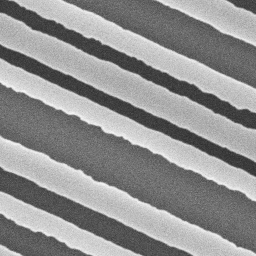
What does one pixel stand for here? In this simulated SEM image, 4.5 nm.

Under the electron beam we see lines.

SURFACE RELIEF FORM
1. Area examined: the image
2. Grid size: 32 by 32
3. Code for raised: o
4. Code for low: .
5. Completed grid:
..ooooooo............oooooooo...
....ooooooo............oooooooo.
oo.....oooooo............ooooooo
oooo.....oooooo............ooooo
oooooo.....ooooooo...........ooo
ooooooooo....ooooooo............
...oooooooo....ooooooo..........
.....oooooooo.....oooooo........
ooo....oooooooo....ooooooo......
ooooo....ooooooooo....oooooo....
ooooooo....oooooooo.....ooooooo.
...oooooo....oooooooo.....oooooo
.....oooooo....ooooooooo....oooo
.......oooooo.....oooooooo....oo
..........oooooo....oooooooo....
............oooooo....oooooooo..
.............ooooooo....oooooooo
o...............oooooo....oooooo
ooo...............ooooooo...oooo
oooooo..............ooooooo....o
oooooooo..............ooooooo...
..oooooooo...............oooooo.
....oooooooo...............ooooo
......oooooooo...............ooo
o.......oooooooo...............o
ooo.......oooooooo..............
oooooo.......oooooooo...........
..oooooo.......oooooooo.........
....oooooo.......oooooooo.......
.......ooooo.......oooooooo.....
........oooooo.......oooooooo...
oo.........oooooo.......oooooooo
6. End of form